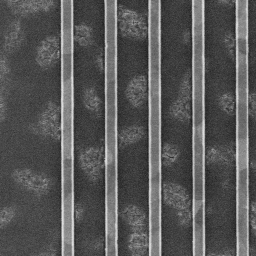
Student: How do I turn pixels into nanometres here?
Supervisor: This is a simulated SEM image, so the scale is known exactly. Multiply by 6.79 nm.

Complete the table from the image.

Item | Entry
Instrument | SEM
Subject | parallel lines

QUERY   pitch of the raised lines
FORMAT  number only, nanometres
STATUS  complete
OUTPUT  297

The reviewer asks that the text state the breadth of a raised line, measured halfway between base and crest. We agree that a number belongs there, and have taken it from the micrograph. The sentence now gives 72.1 nm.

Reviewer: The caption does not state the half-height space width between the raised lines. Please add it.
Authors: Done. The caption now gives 0.227 µm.